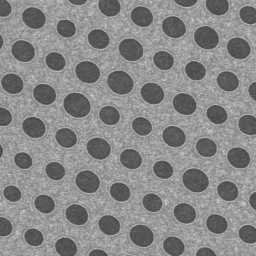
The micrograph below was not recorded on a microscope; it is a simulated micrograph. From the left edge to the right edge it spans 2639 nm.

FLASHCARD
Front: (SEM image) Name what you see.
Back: a regular array of holes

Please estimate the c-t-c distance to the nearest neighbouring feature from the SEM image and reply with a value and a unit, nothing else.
350 nm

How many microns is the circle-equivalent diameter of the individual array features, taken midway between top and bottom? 0.224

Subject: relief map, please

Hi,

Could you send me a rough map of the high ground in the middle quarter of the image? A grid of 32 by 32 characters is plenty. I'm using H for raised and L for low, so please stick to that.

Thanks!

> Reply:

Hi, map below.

HHHLLLLLHHHHHHHHHHHHHHHLLLLHHHLL
HHHLLLLLLHHHHHHHHHHHHHHHLLHHHHLL
HHHLLLLLLHHLLLLLHHHHHHHHHHHHHHHL
HHHLLLLLLHHLLLLLLHHHHHHHHHHHHHHL
HHHHHLLLHHHLLLLLLHHHHHHHHHHHHHHH
HHHHHHHHHHHLLLLLLHHHLLLLHHHHHHHH
HHHHHHHHHHHHLLLLLHHLLLLLLHHHHHHH
HLLLHHHHHHHHHLLLHHHLLLLLLHHHLLLH
LLLLLLHHHHHHHHHHHHHLLLLLLHHLLLLL
LLLLLLLHHHHHHHHHHHHHHLLLHHHLLLLL
LLLLLLLHHHLLHHHHHHHHHHHHHHHLLLLL
LLLLLLLHHLLLLHHHHHHHHHHHHHHHLLLL
HLLLLLHHHLLLLLHHHHHHHHHHHHHHHLLL
HHHLHHHHHLLLLLHHHHLLHHHHHHHHHHHH
HHHHHHHHHHLLLLHHHLLLLLHHHHHHHHHH
HHHHHHHHHHHHHHHHHLLLLLHHHHLLHHHH
LLHHHHHHHHHHHHHHHLLLLLHHHLLLLLHH
LLLHHHHHHHHHHHHHHHLLLHHHHLLLLLHH
LLLHHHHLLHHHHHHHHHHHHHHHHLLLLLLH
LLLHHHLLLLLHHHHHHHHHHHHHHLLLLLHH
LLHHHHLLLLLLHHHHHHHHHHHHHHLLLHHH
HHHHHHLLLLLLHHHLLLHHHHHHHHHHHHHH
HHHHHHLLLLLHHHLLLLLHHHHHHHHHHHHH
HHHHHHHLLLLHHHLLLLLHHHHHHHHHHHHH
HHHHHHHHHHHHHHLLLLLLHHHLLLHHHHHH
HHHHHHHHHHHHHHHLLLLHHHLLLLLHHHHH
HHHHHLHHHHHHHHHHHHHHHHLLLLLHHHHL
HHHLLLLLHHHHHHHHHHHHHHHLLLLHHHLL
HHHLLLLLLHHHHHHHHHHHHHHHLLHHHLLL
HHHLLLLLLHHHHHHHHHHHHHHHHHHHHHLL
HHHLLLLLLHHHLLLLHHHHHHHHHHHHHHLL
HHHHLLLLHHHLLLLLHHHHHHHHHHHHHHHL